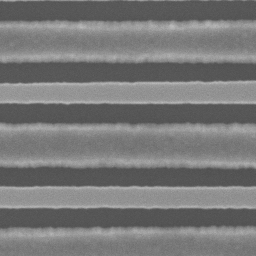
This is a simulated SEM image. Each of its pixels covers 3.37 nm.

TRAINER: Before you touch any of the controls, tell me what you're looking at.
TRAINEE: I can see lines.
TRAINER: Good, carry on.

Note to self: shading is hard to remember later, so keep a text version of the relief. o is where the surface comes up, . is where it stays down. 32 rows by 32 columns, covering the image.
................................
................................
................................
oooooooooooooooooooooooooooooooo
oooooooooooooooooooooooooooooooo
oooooooooooooooooooooooooooooooo
oooooooooooooooooooooooooooooooo
oooooooooooooooooooooooooooooooo
................................
................................
o.o.oooooooooooooooooooooooooooo
oooooooooooooooooooooooooooooooo
oooooooooooooooooooooooooooooooo
................................
................................
....oo..........................
oooooooooooooooooooooooooooooooo
oooooooooooooooooooooooooooooooo
oooooooooooooooooooooooooooooooo
oooooooooooooooooooooooooooooooo
oooooooooooooooooooooooooooooooo
................................
................................
oooooooooooooooooooooooooooooooo
oooooooooooooooooooooooooooooooo
oooooooooooooooooooooooooooooooo
................................
................................
................................
oooooooooooooooooooooooooooooooo
oooooooooooooooooooooooooooooooo
oooooooooooooooooooooooooooooooo